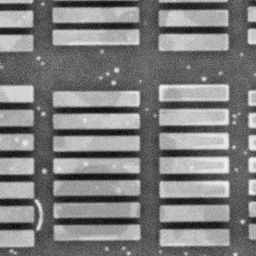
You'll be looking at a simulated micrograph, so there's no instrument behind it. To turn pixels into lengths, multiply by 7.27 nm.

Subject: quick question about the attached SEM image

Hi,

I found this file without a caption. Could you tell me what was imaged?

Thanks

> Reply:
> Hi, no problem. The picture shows groups of lines, slits or small figures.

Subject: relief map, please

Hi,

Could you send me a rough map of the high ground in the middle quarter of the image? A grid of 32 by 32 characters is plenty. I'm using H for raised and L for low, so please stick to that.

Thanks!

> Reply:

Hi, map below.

LLLLLLLLLLLLLLLLLLLLLLLLLLLLLLLL
LLLLLLLLLLLLLLLLLLLLLLLLLLLLLLLL
LLLLLLLLLLLLLLLLLLLLLLLLLLLLLLLL
LLLLLLLLLLLLLLLLLLLLLLLLLLLLLLLL
LLLLLLLLLLLLLLLLLLLLLLLLLLLLLLLL
LLLLLLLLLLLLLLLLLLLLLLLLLLLLLLLL
LLLLLLLLLLLLLLLLLLLLLLLLHHHHHHHH
HHHHHHHHHHHHHHHHHHLLLLLLHHHHHHHH
HHHHHHHHHHHHHHHHHHLLLLLLHHHHHHHH
HHHHHHHHHHHHHHHHHHLLLLLLLLLLLLLL
HHHHHHHHHHHHHHHLLLLLLLLLLLLLLLLL
LLLLLLLLLLLLLLLLLLLLLLLLHHHLLLLL
LLLLLLLLLLLLLLLLLLLLLLLLHHHHHHHH
HHHHHHHHHHHHHHHHHHLLLLLLHHHHHHHH
HHHHHHHHHHHHHHHHHHHLLLLLHHHHHHHH
HHHHHHHHHHHHHHHHHHHLLLLLLLLLLLLL
LLLLLLLLLLLLLLLLLLLLLLLLLLLLLLLL
LLLLLLLLLLLLLLLLLLLLLLLLHHHHHHLL
HHHHHHHHHHHHHHHHHHHLLLLLHHHHHHHH
HHHHHHHHHHHHHHHHHHHLLLLLHHHHHHHH
HHHHHHHHHHHHHHHHHHHLLLLLHHHHHHHH
HHHHHHHHHHHHHHHHHHHLLLLLLLLLLLLL
LLLLLLLLLLLLLLLLLLLLLLLLLLLLLLLL
LLLLLLLLLLLLLLLLLLLLLLLLLLLLLLLL
HHHHHHHHHHHHHHHHHHHLLLLLHHHHHHHH
HHHHHHHHHHHHHHHHHHHLLLLLHHHHHHHH
HHHHHHHHHHHHHHHHHHHLLLLLHHHHHHHH
LLLLLLLLLLLLLLLLLLLLLLLLLLLLLLLL
LLLLLLLLLLLLLLLLLLLLLLLLLLLLLLLL
HHHHHHHHHHHHHHHHHHHLLLLLLLLLLLLL
HHHHHHHHHHHHHHHHHHHLLLLLHHHHHHHH
HHHHHHHHHHHHHHHHHHHLLLLLHHHHHHHH